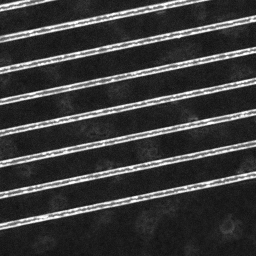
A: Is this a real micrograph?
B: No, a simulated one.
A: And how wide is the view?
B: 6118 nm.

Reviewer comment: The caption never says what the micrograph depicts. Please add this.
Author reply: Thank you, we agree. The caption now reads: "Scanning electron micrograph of parallel lines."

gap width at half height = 609 nanometers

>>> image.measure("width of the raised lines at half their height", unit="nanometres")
123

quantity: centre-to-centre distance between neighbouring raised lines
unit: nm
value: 731